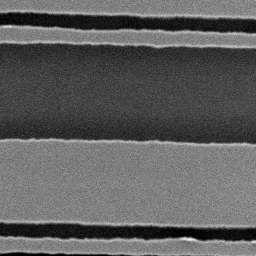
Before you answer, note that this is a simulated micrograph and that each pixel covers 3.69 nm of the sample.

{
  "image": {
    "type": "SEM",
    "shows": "lines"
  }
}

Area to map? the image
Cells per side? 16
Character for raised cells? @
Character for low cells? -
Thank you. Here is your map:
@@@@@@@@@@@@@@@@
@@@@@@@@@@@@@@@@
@@@@@@@@@@@@@@@@
----------------
----------------
----------------
----------------
----------------
----------------
@@@@@@@@@@@@@@@@
@@@@@@@@@@@@@@@@
@@@@@@@@@@@@@@@@
@@@@@@@@@@@@@@@@
@@@@@@@@@@@@@@@@
@@@@@@@@@@@@@@@@
@@@@@@@@@@@@@@@@